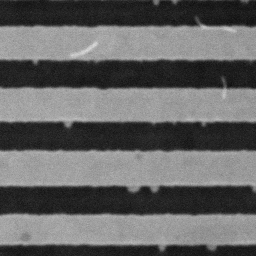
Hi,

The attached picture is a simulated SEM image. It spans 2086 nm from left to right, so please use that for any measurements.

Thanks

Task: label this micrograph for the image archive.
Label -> lines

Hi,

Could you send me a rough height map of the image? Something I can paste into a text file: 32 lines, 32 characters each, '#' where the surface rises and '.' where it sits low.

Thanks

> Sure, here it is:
................................
................................
................................
###########.####################
################################
################################
################################
......###.##...####....##..##...
................................
................................
................................
################################
################################
################################
################################
................................
................................
................................
................................
################################
################################
################################
################################
................................
................................
................................
................................
################################
################################
################################
######.#.#.########.#####.#####.
................................